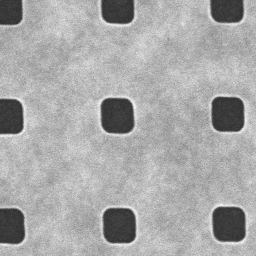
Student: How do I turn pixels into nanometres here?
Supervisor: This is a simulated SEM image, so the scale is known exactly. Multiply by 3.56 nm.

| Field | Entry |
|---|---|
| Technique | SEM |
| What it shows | holes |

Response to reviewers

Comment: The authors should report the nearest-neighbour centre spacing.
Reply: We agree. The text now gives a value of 391 nm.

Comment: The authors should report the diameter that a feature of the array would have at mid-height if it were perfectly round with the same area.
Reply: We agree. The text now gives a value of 132 nanometers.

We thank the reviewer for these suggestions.